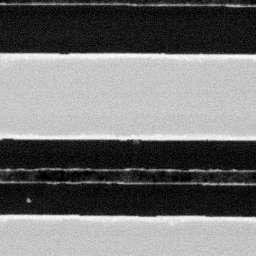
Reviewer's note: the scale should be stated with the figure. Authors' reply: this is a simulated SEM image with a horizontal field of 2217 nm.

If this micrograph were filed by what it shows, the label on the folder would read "lines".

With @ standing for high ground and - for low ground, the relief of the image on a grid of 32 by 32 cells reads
----------------@@@@@@@@@@@@@@@@
--------------------------------
--------------------------------
--------------------------------
--------------------------------
--------------------------------
--------------------------------
@@@@@@@@@@@@@@@@@@@@@@@@@@@@@@@@
@@@@@@@@@@@@@@@@@@@@@@@@@@@@@@@@
@@@@@@@@@@@@@@@@@@@@@@@@@@@@@@@@
@@@@@@@@@@@@@@@@@@@@@@@@@@@@@@@@
@@@@@@@@@@@@@@@@@@@@@@@@@@@@@@@@
@@@@@@@@@@@@@@@@@@@@@@@@@@@@@@@@
@@@@@@@@@@@@@@@@@@@@@@@@@@@@@@@@
@@@@@@@@@@@@@@@@@@@@@@@@@@@@@@@@
@@@@@@@@@@@@@@@@@@@@@@@@@@@@@@@@
@@@@@@@@@@@@@@@@@@@@@@@@@@@@@@@@
--------------------------------
--------------------------------
--------------------------------
--------------------------------
@@@@@@@@@@@@@@@@@@@@@@@@@@@@@@@@
@@@@@@@@@@@@@@@@@@@@@@@@@@@@@@@@
--------------------------------
--------------------------------
--------------------------------
--------------------------------
@@@@@@@@@@@@@@@@@@@@@@@@@@@@@@@@
@@@@@@@@@@@@@@@@@@@@@@@@@@@@@@@@
@@@@@@@@@@@@@@@@@@@@@@@@@@@@@@@@
@@@@@@@@@@@@@@@@@@@@@@@@@@@@@@@@
@@@@@@@@@@@@@@@@@@@@@@@@@@@@@@@@